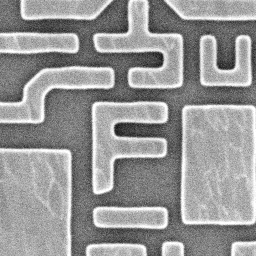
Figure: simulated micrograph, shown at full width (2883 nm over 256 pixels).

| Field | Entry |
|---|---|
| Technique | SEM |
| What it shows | wiring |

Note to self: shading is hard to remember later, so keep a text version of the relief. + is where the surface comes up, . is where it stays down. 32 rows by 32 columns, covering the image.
...+++++++++++..++...+++++++++++
...++++++++++...++....++++++++++
................++..............
................++..............
+++++++++...++++++++++..........
++++++++++..+++++++++++..++...+.
.++++...+...........+++..++...+.
.....................++..++...+.
........+++.........+++..++..++.
....++++++++++..+++++++..++++++.
...+++++++++++..+++++++..++++++.
...+++..........................
...++...........................
+++++.......+++++++++..+++++++++
+++++.......+++++++++..+++++++++
............+++........+++++++++
............++.........+++++++++
............++++++++...+++++++++
............+++++++++..+++++++++
+++++++++...++++++++...+++++++++
+++++++++...++.........+++++++++
+++++++++...++.........+++++++++
+++++++++...++.........+++++++++
+++++++++...++.........+++++++++
+++++++++..............+++++++++
+++++++++..............+++++++++
+++++++++...+++++++++..+++++++++
+++++++++...+++++++++..+++++++++
+++++++++.......................
+++++++++.......................
+++++++++............++......+++
+++++++++..+++++++..+++......+++